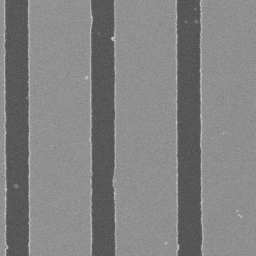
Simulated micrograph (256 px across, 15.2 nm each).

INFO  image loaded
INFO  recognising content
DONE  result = one or a few lines or trenches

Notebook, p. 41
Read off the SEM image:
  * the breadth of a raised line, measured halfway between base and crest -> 373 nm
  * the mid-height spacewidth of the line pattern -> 0.932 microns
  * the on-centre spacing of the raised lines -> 1.3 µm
